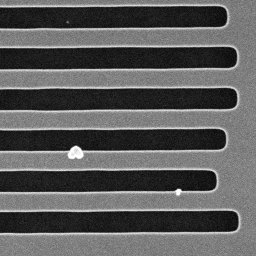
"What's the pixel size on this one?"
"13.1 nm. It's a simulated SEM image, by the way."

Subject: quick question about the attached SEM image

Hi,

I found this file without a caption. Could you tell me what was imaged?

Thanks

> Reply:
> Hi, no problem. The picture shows groups of lines, slits or small figures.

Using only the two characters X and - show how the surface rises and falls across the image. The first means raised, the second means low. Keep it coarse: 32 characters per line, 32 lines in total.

XXXXXXXXXXXXXXXXXXXXXXXXXXXXXXXX
----------------------------XXXX
----------------------------XXXX
-----------------------XXXXXXXXX
XXXXXXXXXXXXXXXXXXXXXXXXXXXXXXXX
XXXXXXXXXXXXXXXXXXXXXXXXXXXXXXXX
------------------------------XX
------------------------------XX
----------------------------XXXX
XXXXXXXXXXXXXXXXXXXXXXXXXXXXXXXX
XXXXXXXXXXXXXXXXXXXXXXXXXXXXXXXX
------------------------------XX
------------------------------XX
-----------------------------XXX
XXXXXXXXXXXXXXXXXXXXXXXXXXXXXXXX
XXXXXXXXXXXXXXXXXXXXXXXXXXXXXXXX
----------------------------XXXX
----------------------------XXXX
---------X------------------XXXX
XXXXXXXXXXXXXXXXXXXXXXXXXXXXXXXX
XXXXXXXXXXXXXXXXXXXXXXXXXXXXXXXX
---------------------------XXXXX
---------------------------XXXXX
---------------------------XXXXX
XXXXXXXXXXXXXXXXXXXXXXXXXXXXXXXX
XXXXXXXXXXXXXXXXXXXXXXXXXXXXXXXX
-----------------------------XXX
------------------------------XX
------------------------------XX
XXXXXXXXXXXXXXXXXXXXXXXXXXXXXXXX
XXXXXXXXXXXXXXXXXXXXXXXXXXXXXXXX
XXXXXXXXXXXXXXXXXXXXXXXXXXXXXXXX